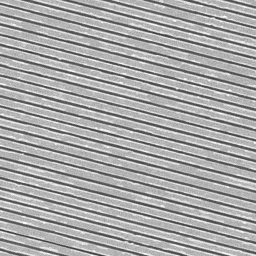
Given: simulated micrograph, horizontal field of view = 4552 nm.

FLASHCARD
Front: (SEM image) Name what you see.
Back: parallel lines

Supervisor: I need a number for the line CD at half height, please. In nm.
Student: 125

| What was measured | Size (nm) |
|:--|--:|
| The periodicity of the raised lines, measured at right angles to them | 177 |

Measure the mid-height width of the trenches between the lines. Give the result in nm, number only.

47.4